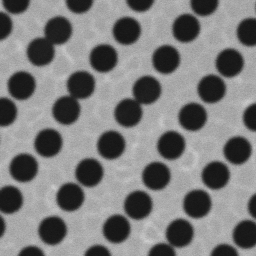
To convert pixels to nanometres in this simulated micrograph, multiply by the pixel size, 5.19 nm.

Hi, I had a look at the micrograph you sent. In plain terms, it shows a regular array of holes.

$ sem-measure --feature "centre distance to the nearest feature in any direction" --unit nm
177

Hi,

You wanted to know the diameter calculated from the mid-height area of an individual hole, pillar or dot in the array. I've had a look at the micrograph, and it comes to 148 nm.